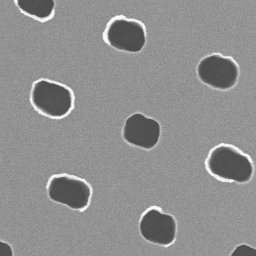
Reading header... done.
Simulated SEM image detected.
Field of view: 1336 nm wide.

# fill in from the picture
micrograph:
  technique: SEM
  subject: holes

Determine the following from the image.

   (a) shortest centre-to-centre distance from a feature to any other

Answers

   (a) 94.8 pixels